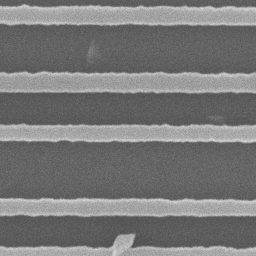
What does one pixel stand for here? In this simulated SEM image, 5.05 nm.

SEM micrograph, lines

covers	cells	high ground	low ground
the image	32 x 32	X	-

--------------------------------
XXXXXXXXXXXXXXXXXXXXXXXXXXXXXXXX
XXXXXXXXXXXXXXXXXXXXXXXXXXXXXXXX
--------------------------------
--------------------------------
--------------------------------
--------------------------------
--------------------------------
--------------------------------
XXXXXXXXXXXXXXXXXXXXXXXXXXXXXXXX
XXXXXXXXXXXXXXXXXXXXXXXXXXXXXXXX
XXXXXXXXXXXXXXXXXXXXXXXXXXXXXXXX
--------------------------------
--------------------------------
--------------------------------
--------------------------------
XXXXXXXXXXXXXXXXXXXXXXXXXXXXXXXX
XXXXXXXXXXXXXXXXXXXXXXXXXXXXXXXX
--------------------------------
--------------------------------
--------------------------------
--------------------------------
--------------------------------
--------------------------------
--------------------------------
XXXXXXXXXXXXXXXXXXXXXXXXXXXXXXXX
XXXXXXXXXXXXXXXXXXXXXXXXXXXXXXXX
--------------------------------
--------------------------------
---------------XX---------------
--------------XX----------------
XXXXXXXXXXXXXXXXXXXXXXXXXXXXXXXX